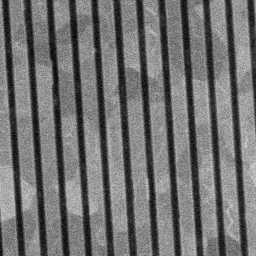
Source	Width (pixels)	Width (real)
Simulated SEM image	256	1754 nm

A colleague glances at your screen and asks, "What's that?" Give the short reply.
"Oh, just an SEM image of parallel lines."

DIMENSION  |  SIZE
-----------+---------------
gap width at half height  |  8.23 px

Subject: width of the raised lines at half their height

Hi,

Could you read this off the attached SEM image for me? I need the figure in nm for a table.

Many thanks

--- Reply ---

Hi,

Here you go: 99.9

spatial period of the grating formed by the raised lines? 152 nanometres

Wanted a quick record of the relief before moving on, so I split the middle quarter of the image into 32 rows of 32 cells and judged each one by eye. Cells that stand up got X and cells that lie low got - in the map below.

XX--XXXX--XXX--XXXX--XXX---XXX--
XX--XXXX--XXX--XXXX--XXX---XXX--
XX--XXXX--XXX--XXXX--XXX---XXX--
XX--XXXX--XXX---XXX--XXXX--XXX--
XX--XXXX--XXX---XXX--XXXX--XXX--
XX--XXXX--XXX---XXX--XXXX--XXX--
XX--XXXX--XXX---XXX--XXXX--XXX--
XX---XXX--XXXX--XXX--XXXX--XXX--
XXX--XXX--XXXX--XXX--XXXX--XXX--
XXX--XXX--XXXX--XXX--XXXX--XXX--
XXX--XXX--XXXX--XXX---XXX--XXX--
XXX--XXX---XXX--XXXX--XXX--XXXX-
XXX--XXX---XXX--XXXX--XXX--XXXX-
XXX--XXX---XXX--XXXX--XXX--XXXX-
XXX--XXX---XXX--XXXX--XXX--XXXX-
XXX--XXXX--XXX--XXXX--XXX---XXX-
XXX--XXXX--XXX--XXXX--XXX---XXX-
XXX--XXXX--XXX--XXXX--XXX---XXX-
XXX--XXXX--XXX--XXXX--XXX---XXX-
XXX--XXXX--XXX---XXX--XXXX--XXX-
XXX--XXXX--XXX---XXX--XXXX--XXX-
XXX--XXXX--XXX---XXX--XXXX--XXX-
XXX---XXX--XXX---XXX--XXXX--XXX-
XXXX--XXX--XXXX--XXX--XXXX--XXX-
XXXX--XXX--XXXX--XXX--XXXX--XXX-
XXXX--XXX--XXXX--XXX--XXXX--XXX-
XXXX--XXX--XXXX--XXX---XXX--XXXX
XXXX--XXX---XXX--XXXX--XXX--XXXX
XXXX--XXX---XXX--XXXX--XXX--XXXX
XXXX--XXX---XXX--XXXX--XXX--XXXX
XXXX--XXX---XXX--XXXX--XXX---XXX
-XXX--XXXX--XXX---XXX--XXX---XXX